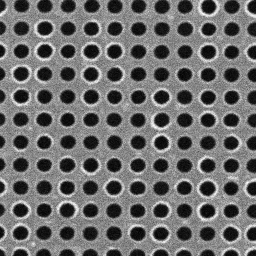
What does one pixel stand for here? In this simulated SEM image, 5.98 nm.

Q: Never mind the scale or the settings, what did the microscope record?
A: a regular array of holes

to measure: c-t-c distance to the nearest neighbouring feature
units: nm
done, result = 135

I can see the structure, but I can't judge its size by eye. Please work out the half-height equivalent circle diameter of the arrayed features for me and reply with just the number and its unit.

88.3 nm